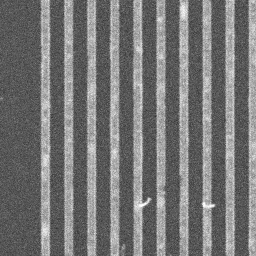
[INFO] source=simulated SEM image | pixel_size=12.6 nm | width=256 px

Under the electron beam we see parallel lines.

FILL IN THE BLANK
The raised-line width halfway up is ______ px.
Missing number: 7.25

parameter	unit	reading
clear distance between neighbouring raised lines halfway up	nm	206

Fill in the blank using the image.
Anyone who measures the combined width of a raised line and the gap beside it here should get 292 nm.